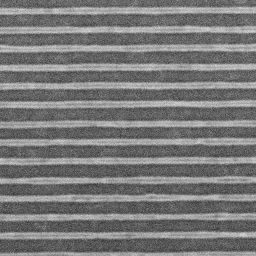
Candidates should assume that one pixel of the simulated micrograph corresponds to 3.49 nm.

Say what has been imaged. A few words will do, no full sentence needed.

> parallel lines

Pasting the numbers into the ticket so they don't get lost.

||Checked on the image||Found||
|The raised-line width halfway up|16.6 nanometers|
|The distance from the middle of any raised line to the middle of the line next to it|65.4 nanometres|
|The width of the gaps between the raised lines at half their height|50.2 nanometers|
